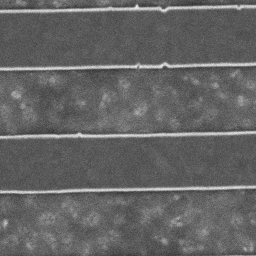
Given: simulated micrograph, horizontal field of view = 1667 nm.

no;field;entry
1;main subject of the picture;one or a few lines or trenches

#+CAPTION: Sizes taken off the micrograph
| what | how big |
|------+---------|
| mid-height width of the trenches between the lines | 439 nm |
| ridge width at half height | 0.372 microns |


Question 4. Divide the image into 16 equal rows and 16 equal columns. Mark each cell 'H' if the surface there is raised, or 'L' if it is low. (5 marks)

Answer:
LLLLLLLLHLLHHHHH
HHHHHHHHHHHHHHHH
HHHHHHHHHHHHHHHH
HHHHHHHHHHHHHHHH
LLLLLLLLLLLLLLLL
LLLLLLLLLLLLLLLL
LLLLLLLLLLLLLLLL
LLLLLLLLLLLLLLLL
LLLHHHHHHHHHHHHH
HHHHHHHHHHHHHHHH
HHHHHHHHHHHHHHHH
HHHHHHHHHHHHHHHH
LLLLLLLLLLLLLLLL
LLLLLLLLLLLLLLLL
LLLLLLLLLLLLLLLL
LLLLLLLLLLLLLLLL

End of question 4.